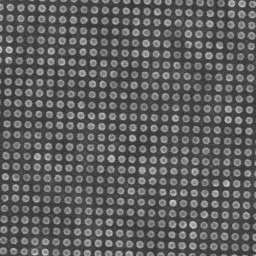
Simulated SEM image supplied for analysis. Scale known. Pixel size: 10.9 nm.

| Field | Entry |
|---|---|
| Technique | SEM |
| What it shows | a regular array of raised bodies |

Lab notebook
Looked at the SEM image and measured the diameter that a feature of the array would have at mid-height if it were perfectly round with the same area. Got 70.9 nm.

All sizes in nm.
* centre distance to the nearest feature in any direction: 111